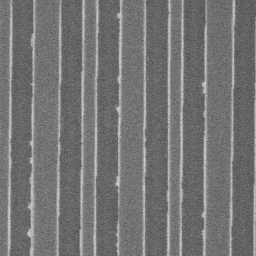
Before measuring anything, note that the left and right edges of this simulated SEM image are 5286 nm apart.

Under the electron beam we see lines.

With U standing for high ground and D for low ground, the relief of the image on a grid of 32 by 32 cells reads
UDDDUUUUDDUUDDDUUUDDDUUDDDUUUDDD
UDDDUUUUDDUUDDDUUUDDDUUDDDUUUDDD
UDDDUUUUDDUUDDDUUUDDDUUDDDUUUDDD
UDDDUUUUDDUUDDDUUUDDDUUDDDUUUDDD
UDDDUUUUDDUUDDDUUUDDDUUDDDUUUDDD
UDDDUUUUDDUUDDDUUUDDDUUDDDUUUDDD
UDDDUUUUDDUUDDDUUUDDDUUDDDUUUDDD
UDDDUUUUDDUUDDDUUUDDDUUDDDUUUDDD
UDDDUUUUDDUUDDDUUUDDDUUDDDUUUDDD
UDDDUUUDDDUUDDDUUUDDDUUDDDUUUDDD
UDDDUUUDDDUUDDDUUUDDDUUDDDUUUDDD
UDDDUUUDDDUUDDDUUUDDDUUDDDUUUDDD
UDDDUUUDDDUUDDDUUUDDDUUDDDUUUDDD
UDDDUUUDDDUUDDDUUUDDDUUDDDUUUDDD
UDDDUUUDDDUUDDDUUUDDDUUDDDUUUDDD
UDDDUUUDDDUUDDDUUUDDDUUDDDUUUDDD
UDDDUUUDDDUUDDDUUUDDDUUDDDUUUDDD
UDDDUUUDDDUUDDDUUUDDDUUDDDUUUDDD
UDDDUUUDDDUUDDDUUUDDDUUDDDUUUDDD
UDDDUUUDDDUUDDDUUUDDDUUDDDUUUDDD
UDDDUUUDDDUUDDDUUUDDDUUDDDUUUDDD
UDDDUUUDDDUUDDDUUUDDDUUDDDUUUDDD
UDDDUUUDDDUUDDDUUUDDDUUDDDUUUDDD
UDDDUUUDDDUUDDDUUUDDDUUDDDUUUDDD
UDDDUUUDDDUUDDDUUUDDDUUDDDUUUDDD
UDDDUUUDDDUUDDDUUUDDDUUDDDUUUDDD
UDDDUUUDDDUUDDDUUUDDDUUDDDUUUDDD
UDDDUUUDDDUUDDDUUUDDDUUDDDUUUDDD
UDDDUUUDDDUUDDDUUUDDDUUDDDUUUDDD
UDDDUUUDDDUUDDDUUUDDDUUDDDUUUDDD
UDDDUUUDDDUUDDDUUUDDDUUDDDUUUDDD
UDDDUUUDDDUUDDDUUUDDDUUDDDUUUDDD